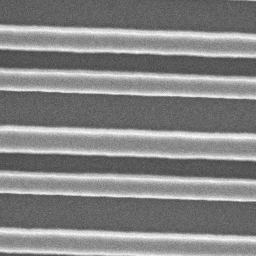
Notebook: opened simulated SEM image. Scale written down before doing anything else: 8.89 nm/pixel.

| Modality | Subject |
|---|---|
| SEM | lines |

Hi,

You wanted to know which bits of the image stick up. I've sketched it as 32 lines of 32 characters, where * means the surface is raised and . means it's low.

................................
................................
................................
................................
***************************.**..
********************************
................****************
................................
................................
********************............
********************************
.......*************************
................................
................................
................................
................................
*************...................
********************************
********************************
..................**************
................................
................................
***************************.....
********************************
..............******************
................................
................................
................................
................................
****************................
********************************
.*******************************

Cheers